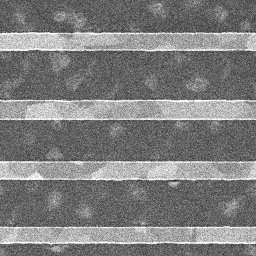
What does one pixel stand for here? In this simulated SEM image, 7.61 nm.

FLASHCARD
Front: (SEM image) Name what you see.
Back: one or a few lines or trenches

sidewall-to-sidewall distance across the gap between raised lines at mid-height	358	nm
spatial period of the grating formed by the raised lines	64.4	pixels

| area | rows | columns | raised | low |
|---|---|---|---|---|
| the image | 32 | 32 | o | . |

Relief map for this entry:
................................
................................
................................
................................
oooooooooooooooooooooooooooooooo
oooooooooooooooooooooooooooooooo
................................
................................
................................
................................
................................
................................
................................
oooooooooooooooooooooooooooooooo
oooooooooooooooooooooooooooooooo
................................
................................
................................
................................
................................
oooooooooooooooooooooooooooooooo
oooooooooooooooooooooooooooooooo
.............ooo..ooooo.....o...
................................
................................
................................
................................
................................
o.oooooooooooooooooooooooooooooo
oooooooooooooooooooooooooooooooo
................................
................................